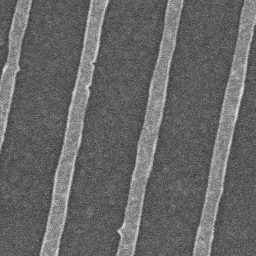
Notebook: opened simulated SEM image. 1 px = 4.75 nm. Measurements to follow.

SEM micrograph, one or a few lines or trenches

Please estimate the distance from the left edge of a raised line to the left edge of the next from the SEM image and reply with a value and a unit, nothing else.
0.354 µm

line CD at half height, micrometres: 0.0675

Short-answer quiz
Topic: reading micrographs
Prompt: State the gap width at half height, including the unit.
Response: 288 nanometres